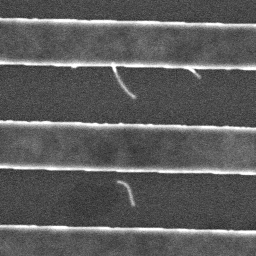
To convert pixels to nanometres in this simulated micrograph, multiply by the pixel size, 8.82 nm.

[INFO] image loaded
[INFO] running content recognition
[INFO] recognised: lines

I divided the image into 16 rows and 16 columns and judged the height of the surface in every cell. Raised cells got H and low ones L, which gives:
LLLLLLLLLLLLLLLL
HHHHHHHHHHHHHHLL
HHHHHHHHHHHHHHHH
HHHHHHHHHHHHHHHH
LLLLLLLLLLLLLLLL
LLLLLLLLLLLLLLLL
LLLLLLLLLLLLLLLL
LLLLLLLLLLLLLLLL
HHHHHHHHHHHHHHHH
HHHHHHHHHHHHHHHH
HHHHHHHHHHHHHHHH
LLLLLLLLLLLLLLLL
LLLLLLLLLLLLLLLL
LLLLLLLLLLLLLLLL
HHHHHHHHHHHHHHHH
HHHHHHHHHHHHHHHH